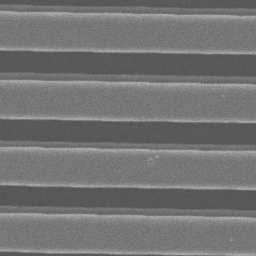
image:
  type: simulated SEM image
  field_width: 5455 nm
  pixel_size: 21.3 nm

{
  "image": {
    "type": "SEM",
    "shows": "lines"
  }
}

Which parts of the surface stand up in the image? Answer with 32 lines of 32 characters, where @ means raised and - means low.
--------------------------------
@@@@@@@@@@@@@@@@@@@@@@@@@@@@@@@@
@@@@@@@@@@@@@@@@@@@@@@@@@@@@@@@@
@@@@@@@@@@@@@@@@@@@@@@@@@@@@@@@@
@@@@@@@@@@@@@@@@@@@@@@@@@@@@@@@@
@@@@@@@@@@@@@@@@@@@@@@@@@@@@@@@@
---------------@@@@@@@@@@@@@@@@@
--------------------------------
--------------------------------
@@@@@@@@@@@@@@@@@---------------
@@@@@@@@@@@@@@@@@@@@@@@@@@@@@@@@
@@@@@@@@@@@@@@@@@@@@@@@@@@@@@@@@
@@@@@@@@@@@@@@@@@@@@@@@@@@@@@@@@
@@@@@@@@@@@@@@@@@@@@@@@@@@@@@@@@
@@@@@@@@@@@@@@@@@@@@@@@@@@@@@@@@
--------------------------------
--------------------------------
--------------------------------
@@@@@@@@@@@@@@@@@@@@@@@@@@@@@@@@
@@@@@@@@@@@@@@@@@@@@@@@@@@@@@@@@
@@@@@@@@@@@@@@@@@@@@@@@@@@@@@@@@
@@@@@@@@@@@@@@@@@@@@@@@@@@@@@@@@
@@@@@@@@@@@@@@@@@@@@@@@@@@@@@@@@
----------------------@@@@@@@@@@
--------------------------------
--------------------------------
@@@@@@@@@@@@@@@@@@@@@@@@@@@@@@@@
@@@@@@@@@@@@@@@@@@@@@@@@@@@@@@@@
@@@@@@@@@@@@@@@@@@@@@@@@@@@@@@@@
@@@@@@@@@@@@@@@@@@@@@@@@@@@@@@@@
@@@@@@@@@@@@@@@@@@@@@@@@@@@@@@@@
-----@@@@@@@@@@@@@@@@@@@@@@@@@@@